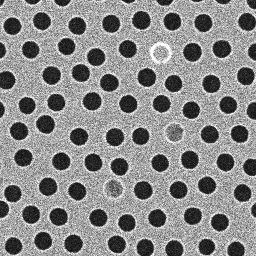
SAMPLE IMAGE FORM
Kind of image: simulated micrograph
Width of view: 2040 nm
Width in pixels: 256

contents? a regular array of holes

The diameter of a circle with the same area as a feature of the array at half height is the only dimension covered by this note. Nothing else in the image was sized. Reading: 144 nm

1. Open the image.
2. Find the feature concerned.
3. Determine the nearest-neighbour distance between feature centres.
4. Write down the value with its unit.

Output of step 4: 227 nanometres